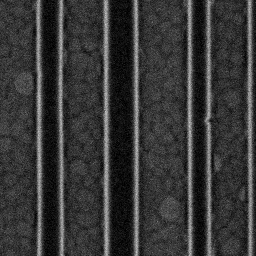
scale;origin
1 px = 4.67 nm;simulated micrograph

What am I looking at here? one or a few lines or trenches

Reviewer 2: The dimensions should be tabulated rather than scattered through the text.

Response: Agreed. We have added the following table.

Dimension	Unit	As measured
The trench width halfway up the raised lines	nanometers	205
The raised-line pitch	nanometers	348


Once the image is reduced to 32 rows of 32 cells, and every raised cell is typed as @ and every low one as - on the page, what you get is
-----@@@-----@@@@-------@@-----@
-----@@@-----@@@@-------@@-----@
-----@@@-----@@@@-------@@-----@
-----@@@-----@@@@-------@@-----@
-----@@@-----@@@@-------@@-----@
-----@@@-----@@@@-------@@-----@
-----@@@-----@@@@-------@@-----@
-----@@@-----@@@@-------@@-----@
-----@@@-----@@@@-------@@-----@
-----@@@-----@@@@-------@@-----@
-----@@@-----@@@@-------@@-----@
-----@@@-----@@@@-------@@-----@
-----@@@-----@@@@-------@@-----@
-----@@@-----@@@@-------@@-----@
-----@@@-----@@@@-------@@-----@
-----@@@-----@@@@-------@@-----@
-----@@@-----@@@@-------@@-----@
-----@@@-----@@@@-------@@-----@
-----@@@-----@@@@-------@@-----@
-----@@@-----@@@@-------@@-----@
-----@@@-----@@@@-------@@-----@
-----@@@-----@@@@-------@@-----@
-----@@@-----@@@@-------@@-----@
-----@@@-----@@@@-------@@-----@
-----@@@-----@@@@-------@@-----@
-----@@@-----@@@@-------@@-----@
-----@@@-----@@@@-------@@-----@
-----@@@-----@@@@-------@@-----@
-----@@@-----@@@@-------@@-----@
-----@@@-----@@@@-------@@-----@
-----@@@-----@@@@-------@@-----@
-----@@@-----@@@@-------@@-----@